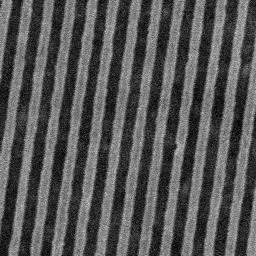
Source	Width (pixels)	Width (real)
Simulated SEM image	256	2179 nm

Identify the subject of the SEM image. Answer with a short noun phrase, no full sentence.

parallel lines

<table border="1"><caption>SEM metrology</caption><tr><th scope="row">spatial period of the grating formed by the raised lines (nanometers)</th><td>182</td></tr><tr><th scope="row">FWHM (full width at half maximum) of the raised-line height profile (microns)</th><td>0.0821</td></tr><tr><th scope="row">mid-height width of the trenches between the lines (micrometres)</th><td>0.104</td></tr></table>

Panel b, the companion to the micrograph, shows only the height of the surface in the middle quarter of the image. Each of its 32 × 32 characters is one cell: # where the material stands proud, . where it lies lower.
#...##...##...###...##...###...#
#...##...##...###...##...###...#
...###...##...##....##...##...##
...###..###...##....##...##...##
...##...###...##...###...##...##
...##...###...##...##....##...##
...##...##....##...##...###...##
...##...##....##...##...###...##
...##...##...###...##...###...##
..###...##...##....##...##...###
..###..###...##....##...##...###
..##...###...##...###...##...##.
..##...###...##...##....##...##.
..##...###...##...##...###...##.
..##...##...###...##...##....##.
..##...##...###...##...##....##.
..##...##...##....##...##...###.
..##...##...##...###...##...###.
.##....##...##...###...##...##..
.##....##...##...###..###...##..
.##...###...##...##...###...##..
.##...##....##...##...###...##..
.##...##...###...##...###...##..
###...##...###...##...###..###..
###...##...###...##...##...###..
##....##...##...###...##...##...
##...###...##...##....##...##...
##...###...##...##...###...##...
##...###...##...##...###...##...
##...##....##...##...###...##...
##...##...###..###...##...###...
##...##...###..###...##...###...